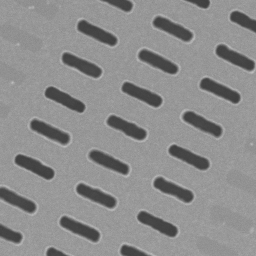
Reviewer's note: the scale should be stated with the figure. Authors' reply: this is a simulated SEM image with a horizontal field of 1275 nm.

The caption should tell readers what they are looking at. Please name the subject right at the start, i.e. a regular array of holes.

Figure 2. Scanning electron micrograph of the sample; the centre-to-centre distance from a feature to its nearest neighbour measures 0.179 µm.